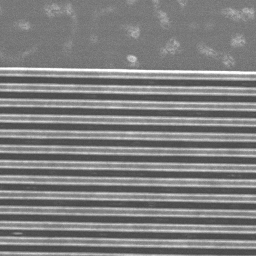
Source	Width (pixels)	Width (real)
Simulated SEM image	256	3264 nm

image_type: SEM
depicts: parallel lines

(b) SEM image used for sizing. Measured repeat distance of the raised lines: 15.3 pixels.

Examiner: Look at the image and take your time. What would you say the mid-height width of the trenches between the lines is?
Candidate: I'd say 0.105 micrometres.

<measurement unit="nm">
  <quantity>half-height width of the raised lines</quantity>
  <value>94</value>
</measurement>